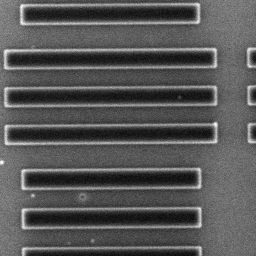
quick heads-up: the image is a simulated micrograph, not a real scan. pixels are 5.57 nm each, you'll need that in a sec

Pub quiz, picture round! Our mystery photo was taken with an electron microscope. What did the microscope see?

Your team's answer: groups of lines, slits or small figures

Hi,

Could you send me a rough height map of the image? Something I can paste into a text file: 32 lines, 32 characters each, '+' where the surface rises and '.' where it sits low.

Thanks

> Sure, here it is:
................................
...++++++++++++++++++++++.......
...++++++++++++++++++++++.......
................................
................................
................................
.++++++++++++++++++++++++++....+
.++++++++++++++++++++++++++....+
.++++++++++.....................
................................
................................
.++++++++++++++++++++++++++....+
.++++++++++++++++++++++++++....+
................................
................................
..........................+.....
.++++++++++++++++++++++++++....+
.++++++++++++++++++++++++++....+
................................
................................
................................
...++++++++++++++++++++++.......
...++++++++++++++++++++++.......
...+++++++++++++................
................................
................................
...++++++++++++++++++++++.......
...++++++++++++++++++++++.......
...+++++++......................
................................
................................
...++++++++++++++++++++++.......